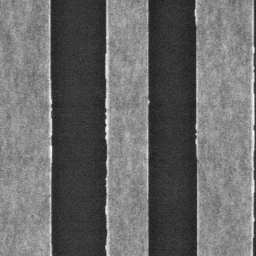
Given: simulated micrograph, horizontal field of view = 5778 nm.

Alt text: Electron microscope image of lines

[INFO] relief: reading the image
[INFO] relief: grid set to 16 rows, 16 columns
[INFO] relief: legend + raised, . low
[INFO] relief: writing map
+++....++...++++
+++....++...++++
+++....++...++++
+++....++...++++
+++....++...++++
+++....++...++++
+++....++...++++
+++....++...++++
+++....++...++++
+++....++...++++
+++....++...++++
+++....++...++++
+++....++...++++
+++....++...++++
+++....++...++++
+++....++...++++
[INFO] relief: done